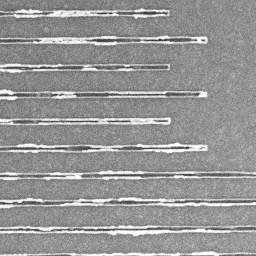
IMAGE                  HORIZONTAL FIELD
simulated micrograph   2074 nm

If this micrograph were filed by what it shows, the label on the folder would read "parallel lines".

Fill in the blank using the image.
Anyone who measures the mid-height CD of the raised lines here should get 47.6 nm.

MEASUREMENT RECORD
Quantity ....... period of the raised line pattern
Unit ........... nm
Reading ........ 219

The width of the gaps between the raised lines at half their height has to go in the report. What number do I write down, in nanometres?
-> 172